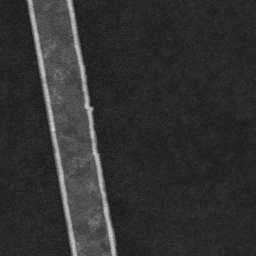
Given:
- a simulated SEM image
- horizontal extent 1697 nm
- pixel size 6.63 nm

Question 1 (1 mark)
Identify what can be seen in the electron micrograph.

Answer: one or a few lines or trenches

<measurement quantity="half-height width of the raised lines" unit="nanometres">250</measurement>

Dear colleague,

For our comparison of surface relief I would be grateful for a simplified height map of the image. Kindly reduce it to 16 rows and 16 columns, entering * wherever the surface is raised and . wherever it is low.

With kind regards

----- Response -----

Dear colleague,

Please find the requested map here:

..**............
..***...........
..***...........
...**...........
...**...........
...**...........
...**...........
...***..........
...***..........
....**..........
....**..........
....**..........
....**..........
....***.........
....***.........
.....**.........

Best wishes